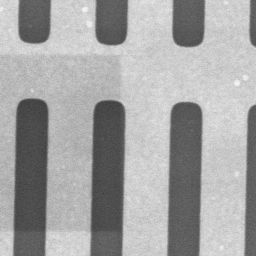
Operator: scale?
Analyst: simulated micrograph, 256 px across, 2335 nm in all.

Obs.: groups of lines, slits or small figures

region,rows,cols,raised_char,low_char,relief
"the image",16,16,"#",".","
#..###..###..###
#..###..###..###
#..###..###..###
################
################
################
#..###..###.####
#..###..###..##.
#..###..###..##.
#..###..###..##.
#..###..###..##.
#..###..##...##.
#..###..##...##.
#..###..##...##.
#..###..##...##.
#..###..##..###.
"